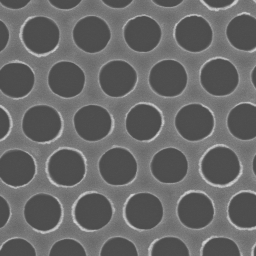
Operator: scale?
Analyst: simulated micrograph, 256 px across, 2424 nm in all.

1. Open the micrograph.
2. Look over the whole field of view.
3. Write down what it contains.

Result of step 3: a regular array of holes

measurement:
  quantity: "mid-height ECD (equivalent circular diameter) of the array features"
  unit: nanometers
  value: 350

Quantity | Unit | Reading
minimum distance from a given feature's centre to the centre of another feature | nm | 479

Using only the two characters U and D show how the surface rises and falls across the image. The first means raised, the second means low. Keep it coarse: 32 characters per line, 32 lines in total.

DDDUUUDDDDUUUDDDUUUUDDUUUUDDDUUU
UUUUUUUUUUUUUUUUUUUUUUUUUUUUUUUU
UUUUDDUUUUDDDUUUDDDUUUUDDDUUUDDD
DUUDDDDUUDDDDDUUDDDDUUDDDDUUDDDD
DUUDDDDUUDDDDDUUDDDDUUDDDDDUDDDD
DUUDDDDUUDDDDUUUDDDDUUDDDDUUUDDD
UUUUDDUUUUUDUUUUUUUUUUUUUUUUUUUU
UUUUUUUUUUUUUUUUUUUUUUUUUUDDUUUU
DDDDUUDDDDUUUDDDDUUDDDDUUDDDDUUU
DDDDUUDDDDDUDDDDDUUDDDDUUDDDDDUD
DDDDUUDDDDDUUDDDDUUDDDDUUDDDDDUU
DDDDUUUDDDUUUDDDUUUUDDDUUUDDDUUU
UUUUUUUUUUUUUUUUUUUUUUUUUUUUUUUU
UUUUDDDUUUDDDUUUUDDUUUUDDDUUUDDD
DUUDDDDUUDDDDDUUDDDDUUDDDDDUUDDD
DUUDDDDDUDDDDDUUDDDDUUDDDDDUUDDD
DUUDDDDUUUDDDDUUDDDDUUDDDDUUUDDD
UUUUDDUUUUUDUUUUUDUUUUUUDUUUUUUU
UUUUUUUUUUUUUUUUUUUUUUUUUUUDUUUU
DDDDUUUDDDUUUDDDDUUDDDDUUUDDDDUU
DDDDUUDDDDUUDDDDDUUDDDDUUDDDDDUU
DDDDUUDDDDDUUDDDDUUDDDDUUDDDDDUU
DDDDUUUDDDUUUDDDUUUUDDDUUUDDDUUU
UUUUUUUUUUUUUUUUUUUUUUUUUUUUUUUU
UUUUDDUUUUUDDUUUUDDUUUUDDDUUUDDD
DUUDDDDUUUDDDDUUDDDDUUDDDDUUUDDD
DUUDDDDDUDDDDDUUDDDDUUDDDDDUUDDD
DUUDDDDUUUDDDDUUDDDDUUUDDDUUUDDD
UUUUDDDUUUUDDUUUUDDUUUUUDUUUUUUU
UUUUUUUUUUUUUUUUUUUUUUUUUUUUUUUU
UDDDUUUDDDUUUDDDDUUDDDDUUUDDDUUU
DDDDUUDDDDDUUDDDDUUDDDDDUDDDDDUU